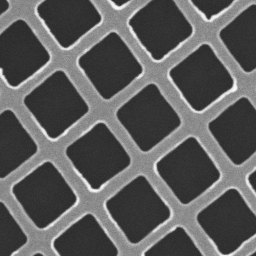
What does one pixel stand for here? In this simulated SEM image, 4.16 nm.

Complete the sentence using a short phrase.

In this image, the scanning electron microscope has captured a regular array of holes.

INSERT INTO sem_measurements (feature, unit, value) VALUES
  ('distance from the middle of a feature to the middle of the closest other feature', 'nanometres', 266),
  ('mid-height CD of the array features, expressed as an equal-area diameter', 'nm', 238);